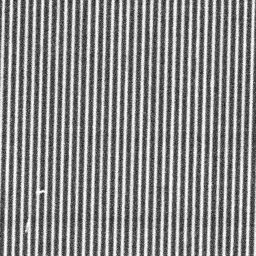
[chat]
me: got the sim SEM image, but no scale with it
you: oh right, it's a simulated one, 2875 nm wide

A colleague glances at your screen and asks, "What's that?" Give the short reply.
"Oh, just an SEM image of parallel lines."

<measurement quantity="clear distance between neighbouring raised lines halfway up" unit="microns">0.0631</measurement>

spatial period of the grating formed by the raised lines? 0.0877 micrometres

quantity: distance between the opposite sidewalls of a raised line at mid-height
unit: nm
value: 18.2